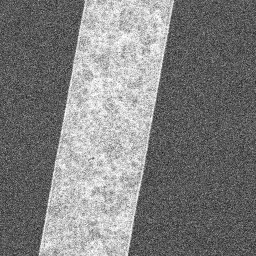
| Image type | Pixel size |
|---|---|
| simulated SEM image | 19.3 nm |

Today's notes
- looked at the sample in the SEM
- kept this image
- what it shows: one or a few lines or trenches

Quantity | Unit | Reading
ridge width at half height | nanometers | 1650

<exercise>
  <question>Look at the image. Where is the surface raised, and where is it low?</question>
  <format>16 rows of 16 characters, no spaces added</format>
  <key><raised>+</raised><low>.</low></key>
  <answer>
.....++++++.....
.....++++++.....
.....+++++......
.....+++++......
.....+++++......
....++++++......
....++++++......
....+++++.......
....+++++.......
....+++++.......
...++++++.......
...++++++.......
...++++++.......
...+++++........
...+++++........
...+++++........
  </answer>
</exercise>